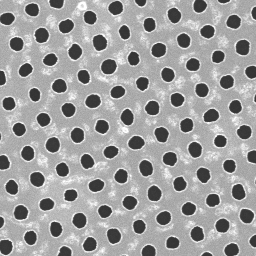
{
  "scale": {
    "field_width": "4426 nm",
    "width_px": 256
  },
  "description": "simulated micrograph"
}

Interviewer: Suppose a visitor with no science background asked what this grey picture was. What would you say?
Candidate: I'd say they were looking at a regular array of holes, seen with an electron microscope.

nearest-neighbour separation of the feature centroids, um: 0.448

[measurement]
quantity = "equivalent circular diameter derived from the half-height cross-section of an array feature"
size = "240 nanometers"